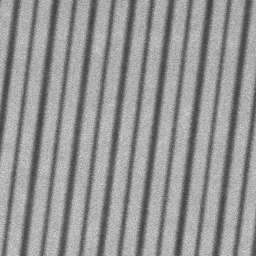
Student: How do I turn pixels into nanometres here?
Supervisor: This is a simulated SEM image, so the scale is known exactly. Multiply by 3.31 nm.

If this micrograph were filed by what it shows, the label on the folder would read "parallel lines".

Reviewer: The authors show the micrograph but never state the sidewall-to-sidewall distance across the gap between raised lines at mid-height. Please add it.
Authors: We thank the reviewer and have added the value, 16.4 nm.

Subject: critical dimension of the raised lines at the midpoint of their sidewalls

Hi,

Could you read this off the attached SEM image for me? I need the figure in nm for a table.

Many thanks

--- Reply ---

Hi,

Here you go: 42.2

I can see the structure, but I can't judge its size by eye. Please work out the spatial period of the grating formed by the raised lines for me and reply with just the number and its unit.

63.3 nanometres